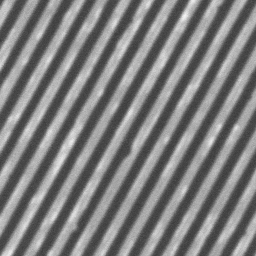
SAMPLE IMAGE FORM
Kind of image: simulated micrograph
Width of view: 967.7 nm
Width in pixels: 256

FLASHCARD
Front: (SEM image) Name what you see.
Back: parallel lines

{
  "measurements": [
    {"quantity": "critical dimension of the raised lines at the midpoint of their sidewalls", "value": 33.4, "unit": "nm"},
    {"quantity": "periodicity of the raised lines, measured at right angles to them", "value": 76.3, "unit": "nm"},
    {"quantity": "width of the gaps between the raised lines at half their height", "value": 11.7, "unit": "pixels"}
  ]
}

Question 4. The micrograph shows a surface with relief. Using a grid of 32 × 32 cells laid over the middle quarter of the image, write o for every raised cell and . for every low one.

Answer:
oo...oo....oo....oo...ooo...oo..
o...ooo...oo....oo....oo...ooo..
....oo....oo...ooo...ooo...oo...
...ooo...oo....oo....oo...ooo...
...oo...ooo...ooo...ooo...oo....
..ooo...oo....oo....oo...ooo...o
..oo...ooo...ooo...oo....oo....o
.ooo...oo....oo....oo...ooo...oo
.oo...ooo...oo....oo....oo...ooo
oo....oo....oo...ooo...oo....oo.
oo...oo....oo....oo...ooo...ooo.
o....oo...ooo...ooo...oo....oo..
o...oo....oo....oo...ooo...ooo..
...ooo...ooo...ooo...oo....oo...
...oo....oo....oo...ooo...ooo...
...oo...ooo...oo....oo....oo...o
..oo....oo...ooo...ooo...oo....o
.ooo...oo....oo....oo...ooo...oo
.oo....oo...ooo...oo....oo....oo
oo....oo....oo...ooo...ooo...oo.
oo...ooo...ooo...oo....oo...ooo.
oo...oo....oo....oo...ooo...oo..
o...ooo...ooo....o....oo...ooo..
....oo....oo....oo...ooo...oo...
...ooo...oo....oo....oo...ooo...
...oo....oo...ooo...oo....oo....
..oo....oo....oo...ooo...oo....o
..oo...ooo...ooo...oo....oo...oo
.oo....oo...ooo...ooo...oo....oo
ooo...ooo...oo....oo...ooo...ooo
oo....oo...ooo...ooo...oo....oo.
oo...ooo...oo....oo...ooo...ooo.